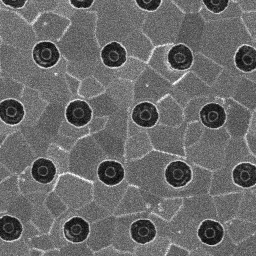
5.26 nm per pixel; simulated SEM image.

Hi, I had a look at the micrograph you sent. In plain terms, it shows a regular array of ring-shaped grooves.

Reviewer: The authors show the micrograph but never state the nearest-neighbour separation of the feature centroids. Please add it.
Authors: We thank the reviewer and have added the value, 351 nm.